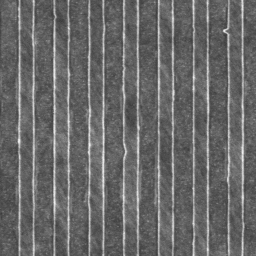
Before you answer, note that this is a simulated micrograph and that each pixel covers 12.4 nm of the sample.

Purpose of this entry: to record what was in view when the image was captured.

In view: parallel lines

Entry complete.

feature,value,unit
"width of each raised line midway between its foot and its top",176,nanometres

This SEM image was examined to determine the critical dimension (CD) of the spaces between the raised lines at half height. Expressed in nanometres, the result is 252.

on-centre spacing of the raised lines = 432 nm